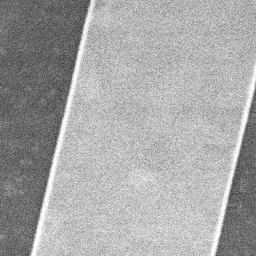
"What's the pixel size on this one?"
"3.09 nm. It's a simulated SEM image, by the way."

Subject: one or a few lines or trenches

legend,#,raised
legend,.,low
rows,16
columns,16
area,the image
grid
......##########
.....###########
.....###########
.....###########
.....###########
.....###########
....############
....###########.
....###########.
....###########.
...############.
...###########..
...###########..
...###########..
..############..
..###########...